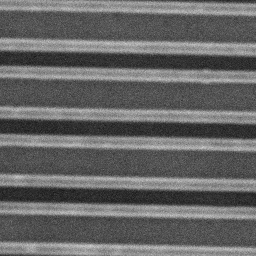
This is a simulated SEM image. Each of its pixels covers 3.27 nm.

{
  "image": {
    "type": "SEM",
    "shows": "parallel lines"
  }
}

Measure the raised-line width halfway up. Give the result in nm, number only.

35.5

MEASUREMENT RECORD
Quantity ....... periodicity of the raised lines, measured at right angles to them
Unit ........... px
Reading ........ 33.8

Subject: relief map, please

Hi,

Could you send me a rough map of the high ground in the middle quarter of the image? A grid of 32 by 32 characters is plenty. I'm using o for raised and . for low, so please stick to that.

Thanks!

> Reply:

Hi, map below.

................................
oooooooooooooooooooooooooo......
oooooooooooooooooooooooooooooooo
oo.ooooooooooooooooooooooooooooo
................................
................................
................................
................................
................................
................................
................................
oooooooo........................
oooooooooooooooooooooooooooooooo
oooooooooooooooooooooooooooooooo
................................
................................
................................
................................
ooooooooooooooooooooooooo.......
oooooooooooooooooooooooooooooooo
..oooooooooooooooooooooooooooooo
................................
................................
................................
................................
................................
................................
................................
ooooooooooooooo.................
oooooooooooooooooooooooooooooooo
oooooooooooooooooooooooooooooooo
................................